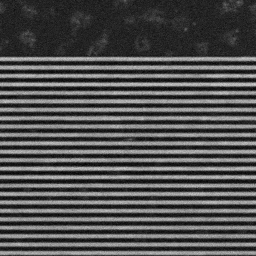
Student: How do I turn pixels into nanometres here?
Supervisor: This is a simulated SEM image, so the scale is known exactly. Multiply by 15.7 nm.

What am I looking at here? parallel lines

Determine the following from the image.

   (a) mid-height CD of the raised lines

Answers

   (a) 41.3 nanometres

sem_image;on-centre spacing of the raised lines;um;0.133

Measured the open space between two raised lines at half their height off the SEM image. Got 92.4 nm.